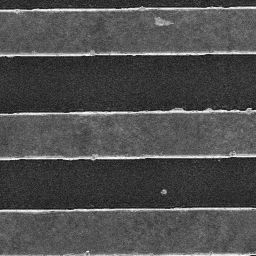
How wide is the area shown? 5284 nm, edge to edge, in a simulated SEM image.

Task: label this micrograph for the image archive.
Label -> lines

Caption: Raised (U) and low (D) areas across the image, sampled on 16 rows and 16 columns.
DDDDDDDDDDDDDUUU
UUUUUUUUUUUUUUUU
UUUUUUUUUUUUUUUU
DDDDDDDDDDDDDDDD
DDDDDDDDDDDDDDDD
DDDDDDDDDDDDDDDD
DDDDDDDDDDDDDDDD
UUUUUUUUUUUUUUUU
UUUUUUUUUUUUUUUU
UUUUUUUUUUUUUUUU
DDDDDDDDDDDDDDDD
DDDDDDDDDDDDDDDD
DDDDDDDDDDDDDDDD
UUUUUUUUUUUUUUUU
UUUUUUUUUUUUUUUU
UUUUUUUUUUUUUUUU